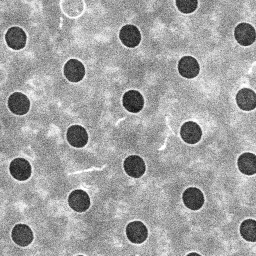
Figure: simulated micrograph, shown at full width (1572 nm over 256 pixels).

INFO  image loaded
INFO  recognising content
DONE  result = a regular array of holes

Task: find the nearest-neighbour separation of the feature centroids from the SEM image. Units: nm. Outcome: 401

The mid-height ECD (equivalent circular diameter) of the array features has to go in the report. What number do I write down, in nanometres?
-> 142